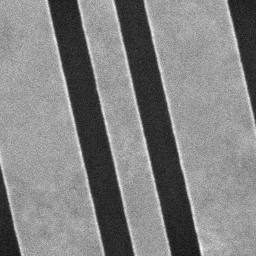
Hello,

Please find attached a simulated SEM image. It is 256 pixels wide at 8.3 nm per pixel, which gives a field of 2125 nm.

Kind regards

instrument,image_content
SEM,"lines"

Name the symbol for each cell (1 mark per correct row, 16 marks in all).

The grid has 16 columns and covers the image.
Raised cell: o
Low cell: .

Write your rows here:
ooo..oo..ooooo..
ooo..oo..oooooo.
ooo..ooo..ooooo.
oooo..oo..ooooo.
oooo..oo..ooooo.
oooo..oo..ooooo.
oooo..ooo.oooooo
ooooo..oo..ooooo
ooooo..oo..ooooo
ooooo..oo..ooooo
ooooo..oo..ooooo
oooooo.ooo..oooo
.ooooo..oo..oooo
.ooooo..oo..oooo
.ooooo..oo..oooo
.ooooo..ooo..ooo